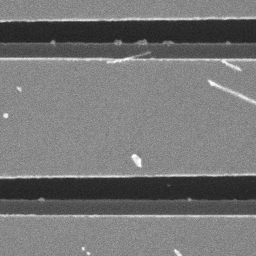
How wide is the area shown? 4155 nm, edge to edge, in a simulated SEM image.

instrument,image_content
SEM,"lines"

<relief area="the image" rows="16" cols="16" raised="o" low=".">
oooooooooooooooo
................
................
................
oooooooooooooooo
oooooooooooooooo
oooooooooooooooo
oooooooooooooooo
oooooooooooooooo
oooooooooooooooo
oooooooooooooooo
................
................
oooooooooooooooo
oooooooooooooooo
oooooooooooooooo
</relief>